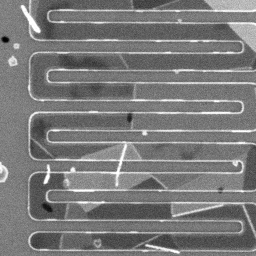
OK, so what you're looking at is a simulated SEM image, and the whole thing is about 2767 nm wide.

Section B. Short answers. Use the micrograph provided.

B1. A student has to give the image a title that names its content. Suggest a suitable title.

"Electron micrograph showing groups of lines, slits or small figures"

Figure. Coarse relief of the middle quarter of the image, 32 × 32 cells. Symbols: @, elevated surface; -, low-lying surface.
@@@@@@@@@@@@@@@@@@@@@@@@@@@@@@@@
-------------------@@@@@@@@-@---
--------------------------------
--------------------------------
--------------------------------
@@@@@@@@@@@@@@@@@@@@@@@@@@@@@@@@
@@@@@@@@@@@@@@@@@@@@@@@@@@@@@@@@
@@@@@@@@@@@@@@@@@@@@@@@@@@@@@@@@
@@@@@@@@@@@@@@@@@@@@@@@@@@@@@@@@
--------------------------------
--------------------------------
--------------------------------
@@@@@@@@@@@@@@@@@@@@@@@@@@@@@@@@
@@@@@@@@@@@@@@@@@@@@@@@@@@@@@@@@
@@@@@@@@@@@@@@@@@@@@@@@@@@@@@@@@
@@@@@@@@@@@@@@@@@@@@@@@@@@@@@@@@
@@@@@@@@@@@@@@@@@@@@@@@@@@@@@@@@
--------------------------------
--------------------------------
--------------------------------
@@@@@@@@@@@@@@@@@@@@@@@@@@@@@@@@
@@@@@@@@@@@@@@@@@@@@@@@@@@@@@@@@
@@@@@@@@@@@@@@@@@@@@@@@@@@@@@@@@
@@@@@@@@@@@@@@@@@@@@@@@@@@@@@@@@
--------------@-----------------
--------------------------------
--------------------------------
@@@@@@@@@@@@@@@@@@@@@@@@@@@@@@@@
@@@@@@@@@@@@@@@@@@@@@@@@@@@@@@@@
@@@@@@@@@@@@@@@@@@@@@@@@@@@@@@@@
@@@@@@@@@@@@@@@@@@@@@@@@@@@@@@@@
@@@@@@@@@@@@@@@@@@@@@@@@@@@@@@@@